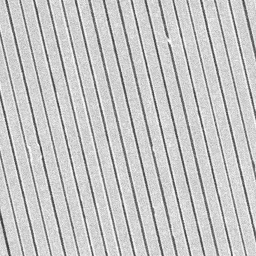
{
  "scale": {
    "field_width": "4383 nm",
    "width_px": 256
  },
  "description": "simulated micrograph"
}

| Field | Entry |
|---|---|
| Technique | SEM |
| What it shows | parallel lines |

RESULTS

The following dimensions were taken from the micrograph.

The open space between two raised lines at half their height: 47.9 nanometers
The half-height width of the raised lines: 190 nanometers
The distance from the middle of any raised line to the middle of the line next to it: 232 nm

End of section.